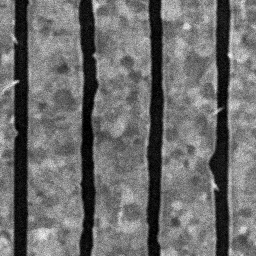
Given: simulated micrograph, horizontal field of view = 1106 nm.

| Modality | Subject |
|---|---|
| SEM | one or a few lines or trenches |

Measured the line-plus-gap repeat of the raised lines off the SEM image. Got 289 nanometers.